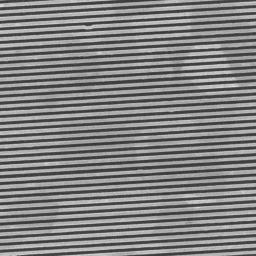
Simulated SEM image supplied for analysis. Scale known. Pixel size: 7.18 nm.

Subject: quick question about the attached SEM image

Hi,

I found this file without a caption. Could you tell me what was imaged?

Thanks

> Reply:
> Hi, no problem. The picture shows parallel lines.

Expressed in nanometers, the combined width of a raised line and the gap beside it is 48.2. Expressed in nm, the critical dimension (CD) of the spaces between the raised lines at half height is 22.4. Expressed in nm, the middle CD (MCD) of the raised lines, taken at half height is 22.4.